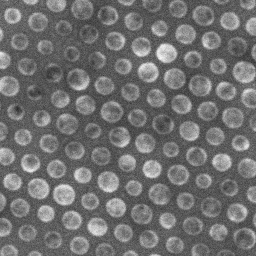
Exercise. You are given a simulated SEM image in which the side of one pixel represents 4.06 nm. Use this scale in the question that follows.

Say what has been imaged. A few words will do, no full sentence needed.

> a regular array of raised bodies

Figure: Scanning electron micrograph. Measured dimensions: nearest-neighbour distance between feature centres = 106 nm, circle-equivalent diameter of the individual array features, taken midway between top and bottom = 72.4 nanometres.